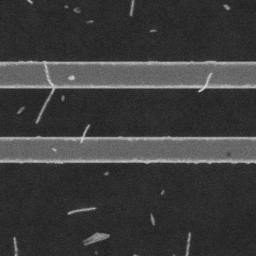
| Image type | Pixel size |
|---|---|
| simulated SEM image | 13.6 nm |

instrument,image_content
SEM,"lines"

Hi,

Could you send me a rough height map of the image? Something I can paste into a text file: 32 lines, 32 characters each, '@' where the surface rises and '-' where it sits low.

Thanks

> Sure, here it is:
--------------------------------
--------------------------------
--------------------------------
--------------------------------
--------------------------------
--------------------------------
--------------------------------
--------------------------------
@@@@@@@@@@@@@@@@@@@@@@@@@@@@@@@@
@@@@@@@@@@@@@@@@@@@@@@@@@@@@@@@@
@@@@@@@@@@@@@@@@@@@@@@@@@@@@@@@@
--------------------------------
--------------------------------
--------------------------------
--------------------------------
--------------------------------
--------------------------------
@@@@@@@@@@@@@@@@@@@@@@@@@@@@@@@@
@@@@@@@@@@@@@@@@@@@@@@@@@@@@@@@@
@@@@@@@@@@@@@@@@@@@@@@@@@@@@@@@@
--------------------------------
--------------------------------
--------------------------------
--------------------------------
--------------------------------
--------------------------------
--------------------------------
--------------------------------
--------------------------------
--------------------------------
--------------------------------
--------------------------------